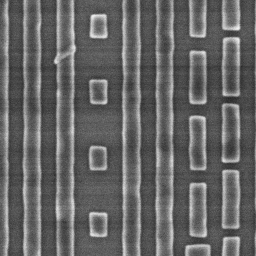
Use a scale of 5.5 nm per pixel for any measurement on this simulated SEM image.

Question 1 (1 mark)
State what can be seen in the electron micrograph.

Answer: wiring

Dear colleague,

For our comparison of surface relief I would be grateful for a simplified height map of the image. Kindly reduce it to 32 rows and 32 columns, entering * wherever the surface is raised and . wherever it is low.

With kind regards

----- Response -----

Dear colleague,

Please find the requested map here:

*..**..**......**...**..**..**..
*..**..**......**...**..**..**..
*..**..**..**..**...**..**..**..
*..**..**..**..**...**..**..**..
*..**..**...*..**...**..*.......
*..**..**......**...**......**..
*..**..**......**...**..*...**..
*..**..**......**...**..**..**..
*..**..**......**...**..**..**..
*..**..**......**...**..**..**..
*..**..**..**..**...**..**..**..
*..**..**..**..**...**..**..**..
*..**..**..**..**...**..**......
*..**..**......**...**......**..
*..**..**......**...**......**..
*..**..**......**...**..**..**..
*..**..**......**...**..**..**..
*..**..**......**...**..**..**..
*..**..**..**..**...**..**..**..
*..**..**..**..**...**..**..**..
*..**..**..**..**...**..**......
*..**..**......**...**......**..
*..**..**......**...**......**..
*..**..**......**...**..**..**..
*..**..**......**...**..**..**..
*..**..**......**...**..**..**..
*..**..**......**...**..**..**..
*..**..**..**..**...**..**..**..
*..**..**..**..**...**..**..**..
*..**..**...*..**...**..*.......
*..**..**......**...**......**..
*..**..**......**...**.***..**..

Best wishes